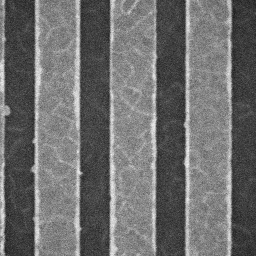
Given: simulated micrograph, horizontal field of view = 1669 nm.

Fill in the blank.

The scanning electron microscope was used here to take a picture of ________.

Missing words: one or a few lines or trenches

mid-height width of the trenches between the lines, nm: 204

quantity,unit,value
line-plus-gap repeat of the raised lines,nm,493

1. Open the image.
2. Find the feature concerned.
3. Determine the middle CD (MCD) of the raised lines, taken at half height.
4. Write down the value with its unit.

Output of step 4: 290 nm